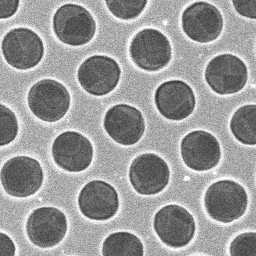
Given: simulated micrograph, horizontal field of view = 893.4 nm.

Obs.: a regular array of holes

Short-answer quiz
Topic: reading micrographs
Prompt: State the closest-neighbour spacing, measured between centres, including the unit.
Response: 196 nm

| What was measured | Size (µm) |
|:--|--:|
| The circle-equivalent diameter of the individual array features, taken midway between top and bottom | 0.146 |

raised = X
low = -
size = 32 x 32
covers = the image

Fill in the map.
--XXXXXX-XXXX-----XXXXXX--XXX---
--XXXXX----XXX----XXXXX----XXX--
XXXXXXX-----XXXXXXXXXXX-----XXXX
XX-XXXX-----XXXXXXXXXXX-----XXXX
X----XX-----XXXXX----XXX---XXXXX
-----XXX---XXXXX-----XXXXXXXXXXX
-----XXXXXXXXXXX-----XXXXXXXXXXX
X----XXXXXX---XXX----XXXXX----XX
XX--XXXXXX-----XX---XXXXXX-----X
XXXXXXXXXX-----XXXXXXXXXXX-----X
XXXX----XX-----XXXXX---XXX-----X
XXXX----XXX---XXXXX-----XXX---XX
XXX------XXXXXXXXXX-----XXXXXXXX
-XXX-----XXXXX---XXX----XXXXXX--
--XXX---XXXXX-----XX----XXXXX---
--XXXXXXXXXXX-----XXXXXXXXXXX---
--XXXXXX-XXXX-----XXXXXX--XXX---
--XXXXX----XXX---XXXXXX----XXX--
XXXXXXX-----XXXXXXXXXXX-----XXXX
XX-XXXX-----XXXXX---XXX-----XXXX
X----XX----XXXXX-----XX----XXXXX
-----XXXXXXXXXXX-----XXXXXXXXXXX
-----XXXXXXXXXXX-----XXXXXXXXXXX
-----XXXXX----XXX----XXXXX----XX
X--XXXXXXX-----XXXXXXXXXXX-----X
XXXXXXXXXX-----XXXXXXXXXXX-----X
XXXX----XX-----XXXXX----XX-----X
XXX-----XXXX-XXXXXX-----XXX--XXX
XXX-----XXXXXXXXXXX-----XXXXXXXX
-XX-----XXXXXX---XXX----XXXXXX--
--XX---XXXXXX-----XXX--XXXXXX---
--XXXXXXXXXXX-----XXXXXXXXXXX---